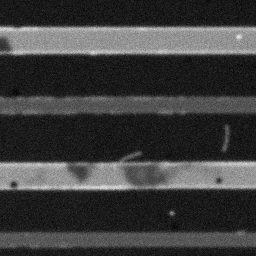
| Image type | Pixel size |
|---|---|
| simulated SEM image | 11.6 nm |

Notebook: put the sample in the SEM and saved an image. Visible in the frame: lines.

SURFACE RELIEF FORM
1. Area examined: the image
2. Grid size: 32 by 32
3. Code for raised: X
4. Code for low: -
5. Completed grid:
--------------------------------
--------------------------------
--------------------------------
--------------------------------
XXXXXXXXXXXXXXXXXXXXXXXXXXXXXXXX
XXXXXXXXXXXXXXXXXXXXXXXXXXXXXXXX
XXXXXXXXXXXXXXXXXXXXXXXXXXXXXXXX
--------------------------------
--------------------------------
--------------------------------
--------------------------------
--------------------------------
XXXXXXXXXXXXXXXXXXXXXXXXXXXXXXXX
XXXXXXXXXXXXXXXXXXXXXXXXXXXXXXXX
--------------------------------
--------------------------------
--------------------------------
--------------------------------
--------------------------------
--------------------------------
--XXX-XXXXXXXXXXXXXXXXXXXXXXXXXX
XXXXXXXXXXXXXXXXXXXXXXXXXXXXXXXX
XXXXXXXXXXXXXXXXXXXXXXXXXXXXXXXX
XXXXXXXX-X-X--X-----------------
--------------------------------
--------------------------------
--------------------------------
--------------------------------
--------------------------------
XXXXXXXXXXXXXXXXXXXXXXXXXXXXXXXX
XXXXXXXXXXXXXXXXXXXXXXXXXXXXXXXX
--------------------------------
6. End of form